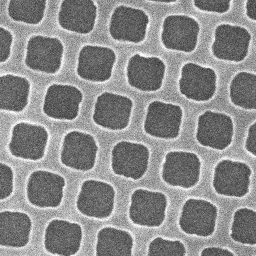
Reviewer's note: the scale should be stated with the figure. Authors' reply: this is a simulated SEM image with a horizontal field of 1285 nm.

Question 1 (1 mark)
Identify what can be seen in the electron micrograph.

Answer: a regular array of holes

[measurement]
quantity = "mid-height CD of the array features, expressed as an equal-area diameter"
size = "194 nm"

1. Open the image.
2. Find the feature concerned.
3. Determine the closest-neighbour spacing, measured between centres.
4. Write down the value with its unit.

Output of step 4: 256 nanometers